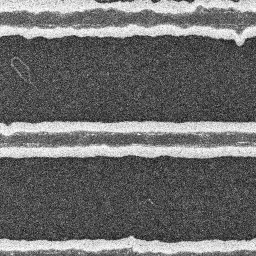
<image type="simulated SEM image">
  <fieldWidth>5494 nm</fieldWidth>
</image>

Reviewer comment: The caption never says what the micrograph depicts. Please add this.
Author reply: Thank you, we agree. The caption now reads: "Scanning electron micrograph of one or a few lines or trenches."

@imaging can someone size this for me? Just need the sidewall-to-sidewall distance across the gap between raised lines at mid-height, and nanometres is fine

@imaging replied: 1980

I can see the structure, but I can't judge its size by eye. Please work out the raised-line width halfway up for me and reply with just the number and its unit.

587 nanometers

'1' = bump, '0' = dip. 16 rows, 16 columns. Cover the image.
1111111111111111
1111111111111111
0000000000000000
0000000000000000
0000000000000000
0000000000000000
0000000000000000
0000000000000000
1111111111111111
1111110111111111
0000000000000000
0000000000000000
0000000000000000
0000000000000000
0000000000000000
1111111111111111